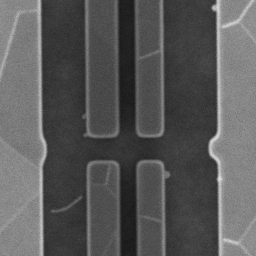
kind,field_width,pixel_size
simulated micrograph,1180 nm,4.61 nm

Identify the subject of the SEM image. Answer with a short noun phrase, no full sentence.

groups of lines, slits or small figures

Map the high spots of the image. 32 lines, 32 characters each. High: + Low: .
+++++......++++..+++.......+++++
+++++......++++..+++.......+++++
+++++......++++..+++.......+++++
+++++......++++..+++.......+++++
+++++......++++..+++.......+++++
+++++......++++..+++.......+++++
+++++......++++..+++.......+++++
+++++......++++..+++.......+++++
+++++......++++..+++.......+++++
+++++......++++..+++.......+++++
+++++......++++..+++.......+++++
+++++......++++..+++.......+++++
+++++......++++..+++.......+++++
+++++......++++..+++.......+++++
+++++......++++..+++.......+++++
+++++......++++..+++.......+++++
+++++......++++..+++.......+++++
+++++......................+++++
++++++....................++++++
++++++.....................+++++
+++++......+++....++.......+++++
+++++......++++..+++.......+++++
+++++......++++..+++.......+++++
+++++......++++..+++.......+++++
+++++......++++..+++.......+++++
+++++......++++..+++.......+++++
+++++......++++..+++.......+++++
+++++......++++..+++.......+++++
+++++......++++..+++.......+++++
+++++......++++..+++.......+++++
+++++......++++..+++........++++
+++++......++++..+++........++++